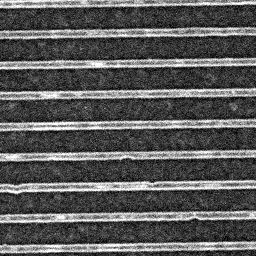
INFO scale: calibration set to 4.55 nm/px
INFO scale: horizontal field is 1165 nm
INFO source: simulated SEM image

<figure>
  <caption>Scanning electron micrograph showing parallel lines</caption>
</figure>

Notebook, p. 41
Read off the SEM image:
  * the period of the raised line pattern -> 0.14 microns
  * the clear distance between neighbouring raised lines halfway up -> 0.109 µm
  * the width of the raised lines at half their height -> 31.3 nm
